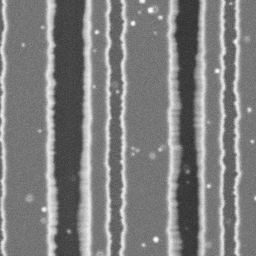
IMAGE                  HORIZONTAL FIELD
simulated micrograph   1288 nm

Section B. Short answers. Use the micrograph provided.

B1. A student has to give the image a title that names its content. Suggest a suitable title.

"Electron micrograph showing lines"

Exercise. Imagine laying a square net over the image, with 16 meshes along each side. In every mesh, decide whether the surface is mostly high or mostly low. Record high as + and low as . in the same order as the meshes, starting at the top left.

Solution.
+++...+++++..+++
+++..++++++..+++
+++...+++++..+++
+++...+++++..+++
+++...+++++..+++
+++...+++++..+++
+++...+++++..+++
+++...+++++..+++
+++..++++++..+++
+++..++++++..+++
+++..++++++..+++
+++..++++++..+++
+++..++++++..+++
+++..++++++..+++
+++..++++++..+++
+++..++++++..+++